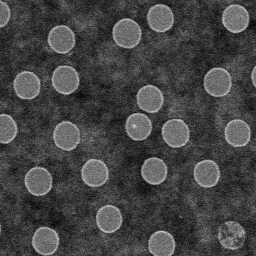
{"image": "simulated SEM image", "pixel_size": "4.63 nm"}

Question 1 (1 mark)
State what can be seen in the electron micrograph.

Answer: a regular array of raised bodies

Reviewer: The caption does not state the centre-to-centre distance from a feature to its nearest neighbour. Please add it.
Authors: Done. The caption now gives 45.1 px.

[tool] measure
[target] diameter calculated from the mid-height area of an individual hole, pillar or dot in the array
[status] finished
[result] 26.9 px